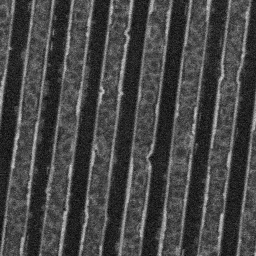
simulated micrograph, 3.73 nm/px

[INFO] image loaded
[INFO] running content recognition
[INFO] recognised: parallel lines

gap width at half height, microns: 0.0672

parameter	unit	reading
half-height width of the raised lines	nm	77.9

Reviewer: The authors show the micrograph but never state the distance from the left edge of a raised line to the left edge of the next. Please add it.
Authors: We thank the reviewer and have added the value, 0.145 µm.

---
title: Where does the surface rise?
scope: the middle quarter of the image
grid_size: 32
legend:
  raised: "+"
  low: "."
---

+++++.....+++++.....+++++....+++
+++++.....+++++....++++++....+++
+++++.....+++++....++++++....+++
+++++....++++++....++++++....+++
+++++....+++++.....+++++.....+++
+++++....+++++.....+++++.....+++
++++.....+++++.....+++++.....+++
++++.....+++++.....+++++....++++
++++.....+++++.....+++++....++++
++++.....+++++....++++++....++++
++++.....+++++.....+++++....++++
++++....++++++....++++++....++++
++++....+++++.....+++++.....++++
++++....+++++.....+++++.....++++
+++.....+++++.....+++++.....++++
+++.....+++++.....+++++....+++++
+++.....+++++.....+++++....+++++
+++.....+++++.....+++++....+++++
+++.....+++++.....+++++....+++++
+++....++++++....++++++....+++++
+++....+++++.....+++++.....+++++
+++....+++++.....+++++.....+++++
++.....+++++.....+++++.....+++++
++.....+++++.....++++......+++++
++.....+++++.....++++......+++++
++.....+++++.....+++++....++++++
++.....+++++.....+++++....+++++.
++....++++++....++++++....+++++.
++....+++++.....+++++.....+++++.
++....+++++.....+++++.....+++++.
+.....+++++.....+++++.....+++++.
+.....+++++.....+++++.....+++++.